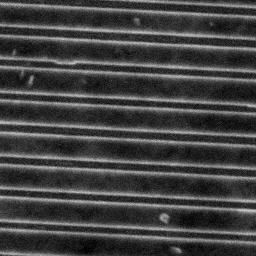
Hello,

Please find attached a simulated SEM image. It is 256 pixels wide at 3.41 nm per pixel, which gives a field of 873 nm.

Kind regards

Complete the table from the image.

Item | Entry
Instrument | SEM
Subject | parallel lines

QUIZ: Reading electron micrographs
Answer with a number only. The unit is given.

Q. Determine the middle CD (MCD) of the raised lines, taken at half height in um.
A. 0.0817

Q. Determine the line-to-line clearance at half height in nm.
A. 27.2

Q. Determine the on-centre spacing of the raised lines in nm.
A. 110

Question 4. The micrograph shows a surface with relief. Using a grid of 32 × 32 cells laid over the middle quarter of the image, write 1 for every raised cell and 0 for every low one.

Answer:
00000000000000000000000111111111
10000000000000000000000000000000
11111111111111111110000000000000
11111111111111111111111111111111
11111111111111111111111111111111
11111111111111111111111111111111
11111111111111111111111111111111
11111111111111111111111111111111
00000000000000011111111111111111
00000000000000000000000000000000
11111111111000000000000000000000
11111111111111111111111111111100
11111111111111111111111111111111
11111111111111111111111111111111
11111111111111111111111111111111
01111111111111111111111111111111
00000000000000011111111111111111
00000000000000000000000000000000
11111110000000000000000000000000
11111111111111111111111111000000
11111111111111111111111111111111
11111111111111111111111111111111
11111111111111111111111111111111
11111111111111111111111111111111
00000000000000001111111111111111
00000000000000000000000000000000
11111111000000000000000000000000
11111111111111111111111111000000
11111111111111111111111111111111
11111111111111111111111111111111
11111111111111111111111111111111
11111111111111111111111111111111